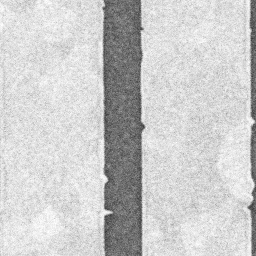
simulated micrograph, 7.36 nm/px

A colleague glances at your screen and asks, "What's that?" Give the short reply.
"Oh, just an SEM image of one or a few lines or trenches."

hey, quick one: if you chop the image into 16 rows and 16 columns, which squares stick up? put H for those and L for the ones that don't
HHHHHHLLLHHHHHHH
HHHHHHLLLHHHHHHH
HHHHHHLLLHHHHHHH
HHHHHHLLLHHHHHHH
HHHHHHLLLHHHHHHH
HHHHHHLLLHHHHHHH
HHHHHHLLLHHHHHHH
HHHHHHLLLHHHHHHH
HHHHHHLLLHHHHHHH
HHHHHHLLLHHHHHHH
HHHHHHLLLHHHHHHH
HHHHHHHLLHHHHHHH
HHHHHHLLLHHHHHHH
HHHHHHHLLHHHHHHH
HHHHHHLLLHHHHHHH
HHHHHHLLLHHHHHHH